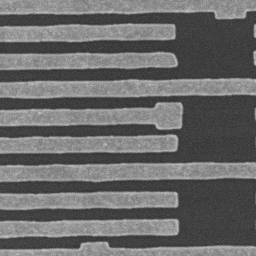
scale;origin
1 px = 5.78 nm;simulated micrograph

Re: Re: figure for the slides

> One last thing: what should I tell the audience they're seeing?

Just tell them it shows wiring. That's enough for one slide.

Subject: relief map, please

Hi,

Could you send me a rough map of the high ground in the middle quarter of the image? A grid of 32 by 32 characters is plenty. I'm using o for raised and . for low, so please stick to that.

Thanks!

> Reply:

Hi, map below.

ooooooooooooooooooooo..oooo.....
................................
................................
................................
.............ooooooooooooooooooo
oooooooooooooooooooooooooooooooo
oooooooooooooooooooooooooooooooo
oooooooooooooooooooooooooooooooo
................................
................................
.......................oooooo...
.......oooooooooooooooooooooo...
ooooooooooooooooooooooooooooo...
ooooooooooooooooooooooooooooo...
ooooooooooooooooooooooooooooo...
.......................oooooo...
................................
................................
......oooooooooooooooooooooo....
oooooooooooooooooooooooooooo....
oooooooooooooooooooooooooooo....
oooooooooooooooooooooooooooo....
................................
................................
................................
oooooooooooooooooooooooooooooooo
oooooooooooooooooooooooooooooooo
oooooooooooooooooooooooooooooooo
oooooooooooooooooooooooooooooooo
................................
................................
................................